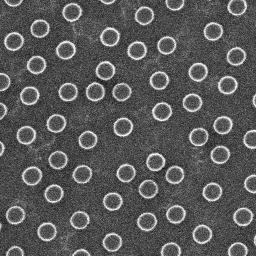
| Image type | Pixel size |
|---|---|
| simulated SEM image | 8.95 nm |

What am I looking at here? a regular array of raised bodies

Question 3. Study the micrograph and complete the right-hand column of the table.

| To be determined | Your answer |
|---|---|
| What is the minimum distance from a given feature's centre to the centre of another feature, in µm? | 0.27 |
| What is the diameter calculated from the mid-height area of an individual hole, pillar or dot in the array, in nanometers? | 157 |